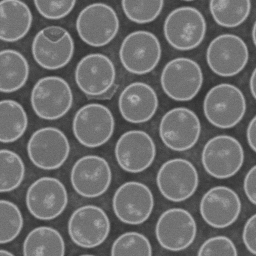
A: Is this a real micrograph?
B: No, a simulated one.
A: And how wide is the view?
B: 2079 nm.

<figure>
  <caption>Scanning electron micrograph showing a regular array of raised bodies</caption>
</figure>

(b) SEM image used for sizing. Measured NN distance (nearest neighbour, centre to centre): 403 nm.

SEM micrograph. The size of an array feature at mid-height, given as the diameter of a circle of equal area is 332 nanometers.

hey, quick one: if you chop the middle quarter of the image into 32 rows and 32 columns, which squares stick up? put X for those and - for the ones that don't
---XXXXXXXXX---XXXXXXXX---XXXXXX
---XXXXXXXXX----XXXXXX---XXXXXXX
---XXXXXXXXXX------------XXXXXXX
---XXXXXXXXX------------XXXXXXXX
---XXXXXXXXX------------XXXXXXXX
X---XXXXXXX-----XXXXX----XXXXXXX
XX---XXXXXX----XXXXXXX---XXXXXXX
XX----XXX-----XXXXXXXXX---XXXXXX
XX------------XXXXXXXXX----XXXXX
XX------------XXXXXXXXX---------
XX---XXXX-----XXXXXXXXX---------
X---XXXXXXX---XXXXXXXXX----XXXX-
---XXXXXXXXX---XXXXXXX----XXXXXX
---XXXXXXXXX---XXXXXX----XXXXXXX
---XXXXXXXXX-----XX-----XXXXXXXX
--XXXXXXXXXX------------XXXXXXXX
--XXXXXXXXXX------------XXXXXXXX
---XXXXXXXXX---XXXXX----XXXXXXXX
---XXXXXXXX---XXXXXXX---XXXXXXXX
X---XXXXXX----XXXXXXXX---XXXXXXX
X-----XX-----XXXXXXXXX----XXXXXX
X------------XXXXXXXXXX---------
X------------XXXXXXXXXX---------
-----XXXX----XXXXXXXXX----------
---XXXXXXX----XXXXXXXX----XXXXX-
---XXXXXXXX---XXXXXXX----XXXXXXX
--XXXXXXXXX-----XXX-----XXXXXXXX
--XXXXXXXXX-------------XXXXXXXX
--XXXXXXXXXX-----------XXXXXXXXX
--XXXXXXXXX------------XXXXXXXXX
--XXXXXXXXX---XXXXXX----XXXXXXXX
---XXXXXXX----XXXXXXX---XXXXXXXX